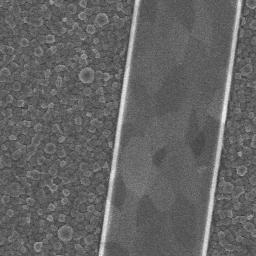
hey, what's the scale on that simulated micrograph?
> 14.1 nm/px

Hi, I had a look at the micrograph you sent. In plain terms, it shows one or a few lines or trenches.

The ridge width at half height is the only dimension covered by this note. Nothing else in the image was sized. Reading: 1440 nm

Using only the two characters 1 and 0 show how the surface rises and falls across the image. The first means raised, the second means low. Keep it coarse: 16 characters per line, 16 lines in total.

0000000011111110
0000000011111110
0000000011111110
0000000011111110
0000000011111100
0000000011111100
0000000011111100
0000000111111100
0000000111111100
0000000111111100
0000000111111100
0000000111111000
0000000111111000
0000000111111000
0000001111111000
0000001111111000